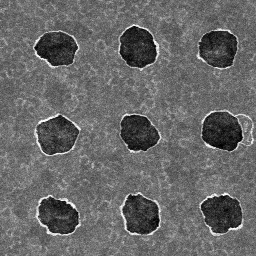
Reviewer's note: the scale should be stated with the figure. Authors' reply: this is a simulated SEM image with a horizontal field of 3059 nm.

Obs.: a regular array of holes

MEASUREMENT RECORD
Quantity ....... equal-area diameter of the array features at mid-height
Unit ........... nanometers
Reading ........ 472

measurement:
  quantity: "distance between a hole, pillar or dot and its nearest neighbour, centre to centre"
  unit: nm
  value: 967